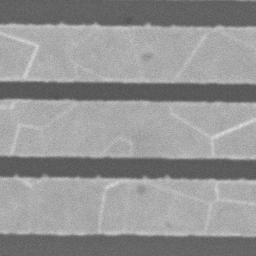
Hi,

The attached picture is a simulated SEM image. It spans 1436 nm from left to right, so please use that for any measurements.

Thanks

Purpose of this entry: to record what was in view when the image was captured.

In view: lines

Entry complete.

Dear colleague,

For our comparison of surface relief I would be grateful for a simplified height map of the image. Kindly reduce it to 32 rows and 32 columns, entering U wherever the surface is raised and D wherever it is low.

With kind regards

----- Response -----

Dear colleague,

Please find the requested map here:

DDDDDDDDDDDDDDDDDDDDDDDDDDDDDDDD
DDDDDDDDDDDDDDDDDDDDDDDDDDDDDDDD
DDDDDDDDDDDDDDDDDDDDDDDDDDDDDDDD
UUUUUUUUUUUUUUUUUUUUUUUUUUUUUUUU
UUUUUUUUUUUUUUUUUUUUUUUUUUUUUUUU
UUUUUUUUUUUUUUUUUUUUUUUUUUUUUUUU
UUUUUUUUUUUUUUUUUUUUUUUUUUUUUUUU
UUUUUUUUUUUUUUUUUUUUUUUUUUUUUUUU
UUUUUUUUUUUUUUUUUUUUUUUUUUUUUUUU
UUUUUUUUUUUUUUUUUUUUUUUUUUUUUUUU
DDDDDDDDDDDDDDDDDDDDDDDDDDDDDDDD
DDDDDDDDDDDDDDDDDDDDDDDDDDDDDDDD
UUUUDDDDUDDDDDDDDDDDDDDDDDDDDDDD
UUUUUUUUUUUUUUUUUUUUUUUUUUUUUUUU
UUUUUUUUUUUUUUUUUUUUUUUUUUUUUUUU
UUUUUUUUUUUUUUUUUUUUUUUUUUUUUUUU
UUUUUUUUUUUUUUUUUUUUUUUUUUUUUUUU
UUUUUUUUUUUUUUUUUUUUUUUUUUUUUUUU
UUUUUUUUUUUUUUUUUUUUUUUUUUUUUUUU
DDUUUUUUUUUUUUUUUUUUUUUUUUUUUUUU
DDDDDDDDDDDDDDDDDDDDDDDDDDDDDDDD
DDDDDDDDDDDDDDDDDDDDDDDDDDDDDDDD
UUUUUUUUUUUUUUUUUUUUUUUUUUUDDDDD
UUUUUUUUUUUUUUUUUUUUUUUUUUUUUUUU
UUUUUUUUUUUUUUUUUUUUUUUUUUUUUUUU
UUUUUUUUUUUUUUUUUUUUUUUUUUUUUUUU
UUUUUUUUUUUUUUUUUUUUUUUUUUUUUUUU
UUUUUUUUUUUUUUUUUUUUUUUUUUUUUUUU
UUUUUUUUUUUUUUUUUUUUUUUUUUUUUUUU
DDDDDDDDDDDDDDDDDDDDDDDDDDDDDDUU
DDDDDDDDDDDDDDDDDDDDDDDDDDDDDDDD
DDDDDDDDDDDDDDDDDDDDDDDDDDDDDDDD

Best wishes